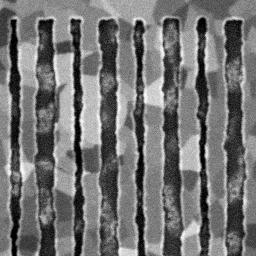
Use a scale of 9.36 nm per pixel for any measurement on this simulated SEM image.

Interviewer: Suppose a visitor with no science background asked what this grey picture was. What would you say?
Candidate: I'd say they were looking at parallel lines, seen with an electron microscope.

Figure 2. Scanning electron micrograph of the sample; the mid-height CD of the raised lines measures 18.4 px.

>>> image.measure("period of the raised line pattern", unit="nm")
294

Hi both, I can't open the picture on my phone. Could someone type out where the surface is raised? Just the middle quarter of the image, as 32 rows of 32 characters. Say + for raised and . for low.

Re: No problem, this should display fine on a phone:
++..+++++....+++++..+++++....+++
++..+++++....+++++..+++++....+++
++..+++++....+++++..+++++....+++
++..+++++....+++++..+++++....+++
++..+++++.....++++..+++++....+++
++...++++.....++++..++++.....+++
+++..++++.....++++..++++.....+++
++...++++....+++++..+++++....+++
++...++++.....++++..+++++....+++
++...++++.....++++..+++++....+++
++...++++.....++++..+++++....+++
++...++++.....++++...++++....+++
++..+++++....++++...+++++....+++
++..+++++....++++...+++++....+++
++..+++++....+++++..+++++....+++
++..+++++....+++++...++++....+++
+++..++++....+++++...++++....+++
++...++++....+++++..+++++....+++
++..+++++....+++++..+++++....+++
++..+++++....+++++..+++++....+++
++..+++++....+++++..+++++....+++
++..+++++....+++++..+++++....+++
+++.+++++....++++++.+++++....+++
+++.+++++....++++++.+++++....+++
+++..++++.....++++..+++++....+++
+++..++++.....++++..+++++....+++
+++..++++.....++++..+++++....+++
+++..++++.....++++..+++++....+++
+++..++++....+++++..+++++.....++
+++.+++++....+++++..+++++.....++
++...++++....+++++..+++++.....++
+++..++++.....++++..++++......++